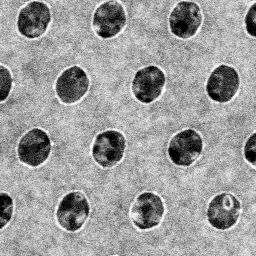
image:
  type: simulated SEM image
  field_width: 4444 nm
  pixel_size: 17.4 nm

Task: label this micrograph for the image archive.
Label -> a regular array of raised bodies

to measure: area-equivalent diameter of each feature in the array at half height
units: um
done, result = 0.632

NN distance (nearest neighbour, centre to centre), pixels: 73.2